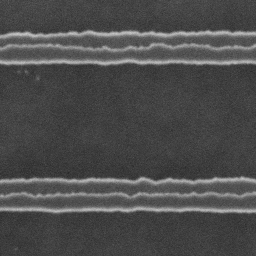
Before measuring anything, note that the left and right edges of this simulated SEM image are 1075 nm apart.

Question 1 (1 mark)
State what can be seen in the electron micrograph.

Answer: lines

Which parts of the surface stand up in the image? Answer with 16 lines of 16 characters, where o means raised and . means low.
................
................
oooooooooooooooo
oooooooooooooooo
................
................
................
................
................
................
................
oooooooooooooooo
oooooooooooooooo
................
................
................